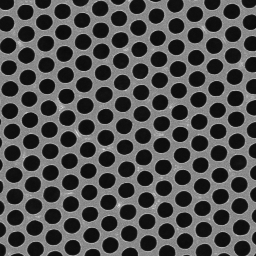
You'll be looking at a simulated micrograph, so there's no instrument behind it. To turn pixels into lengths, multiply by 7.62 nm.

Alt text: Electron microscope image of a regular array of holes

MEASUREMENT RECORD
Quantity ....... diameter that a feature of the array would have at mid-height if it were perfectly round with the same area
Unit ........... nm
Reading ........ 120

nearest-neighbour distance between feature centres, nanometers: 161